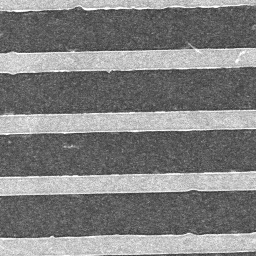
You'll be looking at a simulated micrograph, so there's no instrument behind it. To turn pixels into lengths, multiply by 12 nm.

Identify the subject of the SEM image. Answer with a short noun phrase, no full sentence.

one or a few lines or trenches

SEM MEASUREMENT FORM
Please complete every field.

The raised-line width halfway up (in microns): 0.227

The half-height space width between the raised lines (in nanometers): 518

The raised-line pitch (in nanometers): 740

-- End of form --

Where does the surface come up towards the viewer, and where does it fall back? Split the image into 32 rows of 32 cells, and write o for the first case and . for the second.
oooooooooooooooooooooooooooooooo
................................
................................
................................
................................
................................
............oooooooooooooooooooo
oooooooooooooooooooooooooooooooo
ooooooooooooooooooooooo.........
................................
................................
................................
................................
................................
oooooooooooooooooooooooooooooooo
oooooooooooooooooooooooooooooooo
oooooooooooo....................
................................
................................
................................
................................
................................
oooooooooooooooooooooooooooooooo
oooooooooooooooooooooooooooooooo
................................
................................
................................
................................
................................
.............ooooooooooooooooooo
oooooooooooooooooooooooooooooooo
ooooooooooooooooooooooooooooo...